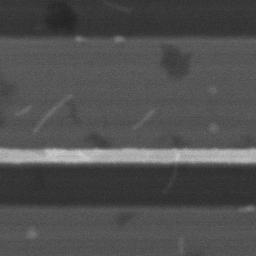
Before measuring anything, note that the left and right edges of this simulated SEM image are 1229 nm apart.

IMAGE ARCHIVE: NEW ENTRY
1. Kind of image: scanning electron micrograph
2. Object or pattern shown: lines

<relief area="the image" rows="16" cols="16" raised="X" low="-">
----------------
----------------
XXXXXXXXXXXXXXXX
XXXXXXXXXXXXXXXX
XXXXXXXXXXXXXXXX
XXXXXXXXXXXXXXXX
XXXXXXXXXXXXXXXX
XXXXXXXXXXXXXXXX
XXXXXXXXXXXXXXXX
XXXXXXXXXXXXXXXX
----------------
----------------
----------------
XXXXXXXXXXXXXXXX
XXXXXXXXXXXXXXXX
XXXXXXXXXXXXXXXX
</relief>